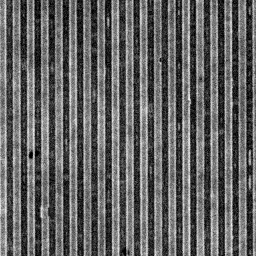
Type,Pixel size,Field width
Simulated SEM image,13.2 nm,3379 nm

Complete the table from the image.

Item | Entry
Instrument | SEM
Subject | parallel lines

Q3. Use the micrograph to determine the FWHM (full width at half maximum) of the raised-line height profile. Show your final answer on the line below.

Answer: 0.0858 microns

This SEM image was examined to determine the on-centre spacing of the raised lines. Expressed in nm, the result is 186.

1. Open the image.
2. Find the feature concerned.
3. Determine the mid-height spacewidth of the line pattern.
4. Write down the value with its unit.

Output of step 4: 97.4 nanometers